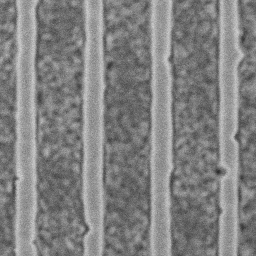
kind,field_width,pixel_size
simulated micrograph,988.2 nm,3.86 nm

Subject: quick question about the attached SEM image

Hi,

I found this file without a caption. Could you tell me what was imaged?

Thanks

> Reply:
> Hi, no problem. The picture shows one or a few lines or trenches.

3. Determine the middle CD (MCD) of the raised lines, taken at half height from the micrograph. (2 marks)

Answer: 72.4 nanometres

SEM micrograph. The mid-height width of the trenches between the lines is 0.189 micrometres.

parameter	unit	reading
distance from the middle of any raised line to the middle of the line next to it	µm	0.261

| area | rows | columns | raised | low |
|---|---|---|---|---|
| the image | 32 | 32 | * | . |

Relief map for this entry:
..***......**......**.......**..
..**.......**......**.......**..
..**.......**......**.......**..
..***......**......**.......**..
..**.......**......**.......**..
..**.......**......**......***..
..**.......**......**......***..
..**.......**......**......***..
..**.......**......**......***..
..**.......**......**......***..
..**.......**......**......***..
..**.......**......**......***..
..**......***......**.......**..
..**......***......**.......**..
..**.......**......**......***..
..**.......**......**......***..
..**.......**......**......***..
..**.......**......**......**...
..**.......**......**.......**..
..**.......**......**.......**..
..**......***......***......**..
..**......***......**.......**..
..**......***......**.......**..
..**......***......**.......**..
..***.....***......**.......**..
..***.....***......**.......**..
..**.......**......**.......**..
..**.......**......**......***..
..**.......**......**.......**..
..**.......**......**......***..
..**......***......**......***..
..***......**......**......***..